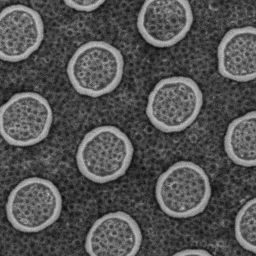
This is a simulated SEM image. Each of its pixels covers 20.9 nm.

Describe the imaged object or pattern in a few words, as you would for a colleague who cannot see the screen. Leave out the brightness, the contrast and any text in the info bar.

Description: raised bodies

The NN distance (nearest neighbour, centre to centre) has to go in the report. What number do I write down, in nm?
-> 1800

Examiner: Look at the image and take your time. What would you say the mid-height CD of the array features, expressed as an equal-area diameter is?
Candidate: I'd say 1050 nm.